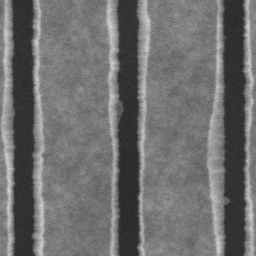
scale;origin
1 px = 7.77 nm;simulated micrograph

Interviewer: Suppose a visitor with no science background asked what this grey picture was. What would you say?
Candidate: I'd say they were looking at lines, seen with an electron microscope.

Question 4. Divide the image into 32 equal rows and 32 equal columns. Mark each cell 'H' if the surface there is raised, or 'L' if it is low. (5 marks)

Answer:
HLLLHHHHHHHHHHLLLLHHHHHHHHHHLLLH
HLLLHHHHHHHHHHLLLLHHHHHHHHHHLLLH
HLLLHHHHHHHHHHLLLLHHHHHHHHHHLLLH
HLLLHHHHHHHHHHLLLLHHHHHHHHHHLLLH
HLLLHHHHHHHHHHLLLLHHHHHHHHHHLLLH
HLLLHHHHHHHHHHLLLLHHHHHHHHHHLLLH
HLLLHHHHHHHHHHLLLLHHHHHHHHHHLLLH
HLLLHHHHHHHHHHLLLLHHHHHHHHHHLLLH
HLLLHHHHHHHHHHLLLLHHHHHHHHHHLLLH
HLLLHHHHHHHHHHLLLLHHHHHHHHHHLLLH
HLLLHHHHHHHHHHLLLLHHHHHHHHHHLLLH
HLLLHHHHHHHHHHLLLLHHHHHHHHHHLLLH
HLLLLHHHHHHHHHLLLLHHHHHHHHHLLLLH
HLLLLHHHHHHHHHLLLLHHHHHHHHHLLLLH
HLLLLHHHHHHHHHLLLLHHHHHHHHHLLLLH
HLLLLHHHHHHHHHLLLLHHHHHHHHHLLLLH
HLLLLHHHHHHHHHLLLLHHHHHHHHHLLLLH
HLLLLHHHHHHHHHLLLLHHHHHHHHHLLLLH
HLLLLHHHHHHHHHLLLHHHHHHHHHHLLLLH
HLLLLHHHHHHHHHHLLLHHHHHHHHHLLLLH
HLLLLHHHHHHHHHHLLLHHHHHHHHHLLLLH
HLLLLHHHHHHHHHHLLLHHHHHHHHHLLLLH
HHLLHHHHHHHHHHLLLLHHHHHHHHHLLLLH
HLLLLHHHHHHHHHLLLLHHHHHHHHHLLLLH
HHLLLHHHHHHHHHLLLHHHHHHHHHHLLLLH
HLLLLHHHHHHHHHLLLHHHHHHHHHHLLLLH
HLLLLHHHHHHHHHLLLHHHHHHHHHHLLLLH
HLLLLHHHHHHHHHHLLLHHHHHHHHHLLLLH
HLLLLHHHHHHHHHLLLLHHHHHHHHHLLLLH
HHLLLHHHHHHHHHLLLLHHHHHHHHHHLLLH
HHLLLHHHHHHHHHLLLLHHHHHHHHHHLLLH
HLLLLHHHHHHHHHLLLLHHHHHHHHHHLLLH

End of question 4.